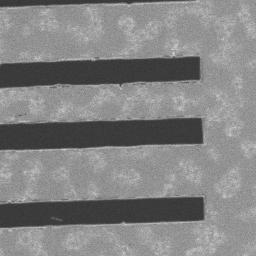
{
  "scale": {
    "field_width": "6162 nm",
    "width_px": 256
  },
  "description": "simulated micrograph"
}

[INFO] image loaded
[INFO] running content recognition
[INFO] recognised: one or a few lines or trenches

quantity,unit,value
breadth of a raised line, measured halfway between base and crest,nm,641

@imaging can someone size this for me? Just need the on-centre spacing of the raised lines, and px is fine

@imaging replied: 70